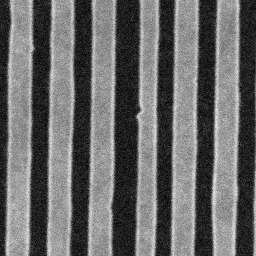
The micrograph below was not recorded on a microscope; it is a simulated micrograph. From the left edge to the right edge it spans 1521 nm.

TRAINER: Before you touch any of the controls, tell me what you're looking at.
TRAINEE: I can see parallel lines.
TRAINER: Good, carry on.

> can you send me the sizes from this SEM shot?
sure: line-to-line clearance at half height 116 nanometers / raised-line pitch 245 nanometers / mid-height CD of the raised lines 129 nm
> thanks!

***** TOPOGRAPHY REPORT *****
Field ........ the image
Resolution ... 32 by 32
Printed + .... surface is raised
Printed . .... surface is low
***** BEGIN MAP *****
.+++...++...++....++..+++..+++..
.+++...++...++....++..+++..+++..
.+++...++...++....++..+++..+++..
.+++...++...++....++..+++..+++..
.+++..+++...++....++..+++..+++..
.+++..+++...++....++..+++..+++..
.+++..+++...++....++..+++..+++..
.+++...++...++....++..+++..+++..
.+++..+++...++....++..+++..+++..
.+++..+++...++....++..+++..+++..
.+++..+++...++....++..+++..+++..
.+++..+++...++....+...+++..+++..
.+++..+++...++...++...+++..+++..
.+++..+++...++....+...++...+++..
.+++..+++...++...++...++...+++..
.+++..+++..+++...++...++...+++..
.+++..+++..+++...++...+++..+++..
.+++..+++..+++...++...+++..+++..
.+++..+++..+++...++...+++..+++..
.+++..+++..+++...++...++...++...
.+++..+++..+++...++...++...++...
.+++..+++..+++...++...++...++...
.+++..+++..+++...++...++...++...
.+++..+++..+++...++...++...+++..
.+++..+++..+++...++...++...+++..
.+++..+++..+++...++...++...+++..
.+++..+++..+++...++...++...++...
.+++..+++..+++...++...++...++...
.+++..+++..+++...++...++...++...
.++...+++..+++...++...++...++...
.++...+++..+++...++...++...++...
.++...+++..+++...++...++...++...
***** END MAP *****